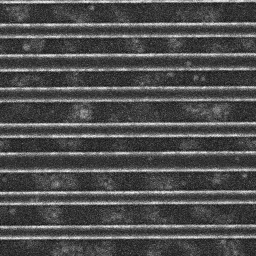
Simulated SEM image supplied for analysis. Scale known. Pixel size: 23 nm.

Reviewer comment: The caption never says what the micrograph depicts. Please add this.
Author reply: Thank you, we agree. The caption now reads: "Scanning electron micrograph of parallel lines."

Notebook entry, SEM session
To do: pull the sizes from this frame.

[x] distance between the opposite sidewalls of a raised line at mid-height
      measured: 313 nanometers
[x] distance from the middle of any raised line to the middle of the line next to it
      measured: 772 nanometres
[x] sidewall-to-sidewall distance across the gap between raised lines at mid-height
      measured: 471 nm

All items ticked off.